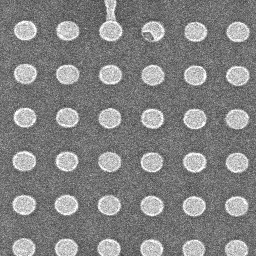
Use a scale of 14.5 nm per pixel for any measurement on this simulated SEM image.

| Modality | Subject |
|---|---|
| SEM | a regular array of raised bodies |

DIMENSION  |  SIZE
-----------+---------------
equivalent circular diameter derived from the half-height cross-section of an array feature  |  303 nanometres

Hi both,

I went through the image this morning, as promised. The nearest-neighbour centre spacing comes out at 614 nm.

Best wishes